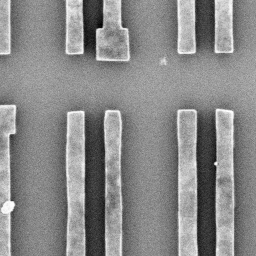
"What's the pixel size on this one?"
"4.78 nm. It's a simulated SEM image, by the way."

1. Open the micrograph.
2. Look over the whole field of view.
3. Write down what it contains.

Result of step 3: wiring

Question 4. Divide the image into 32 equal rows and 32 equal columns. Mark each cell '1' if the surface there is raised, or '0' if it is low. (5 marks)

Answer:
10000000110001100000001100011000
10000000110001100000001100011000
10000000110001100000001100011000
10000000110011110000001100011000
10000000110011110000001100011000
10000000110011110000001100011000
10000000110011110000001100011000
00000000000000000000000000000000
00000000000000000000000000000000
00000000000000000000000000000000
00000000000000000000000000000000
00000000000000000000000000000000
00000000000000000000000000000000
11000000000000000000000000000000
11000000010001100000001100011000
11000000010001100000001100011000
11000000110001100000001100011000
10000000111001100000001100011000
10000000111001100000001100011000
10000000111001100000001100011000
10000000111001100000001100011000
10000000111001100000001100011000
10000000111001100000001110011000
10000000111001100000001110011000
10000000011001100000001110011000
11000000010001100000001110011000
10000000011001100000001110011000
10000000011001100000001110011000
10000000011001100000001110011000
10000000111001100000001110011000
10000000111001100000001110011000
10000000111001100000001110011000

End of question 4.